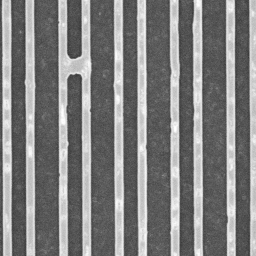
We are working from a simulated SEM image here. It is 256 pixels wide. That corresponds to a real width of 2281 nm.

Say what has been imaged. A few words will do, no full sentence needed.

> parallel lines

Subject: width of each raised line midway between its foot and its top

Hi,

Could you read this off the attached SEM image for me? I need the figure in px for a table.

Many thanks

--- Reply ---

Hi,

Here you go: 7.99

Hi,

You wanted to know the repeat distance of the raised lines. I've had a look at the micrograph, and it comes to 0.249 µm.